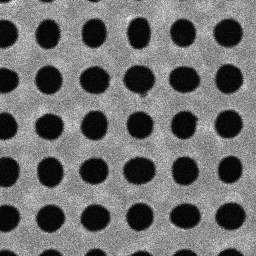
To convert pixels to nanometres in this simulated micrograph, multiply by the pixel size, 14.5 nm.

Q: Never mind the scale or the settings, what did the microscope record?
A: a regular array of holes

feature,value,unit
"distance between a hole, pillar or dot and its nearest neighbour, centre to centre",651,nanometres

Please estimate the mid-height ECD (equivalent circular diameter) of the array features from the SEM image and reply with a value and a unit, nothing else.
0.419 micrometres